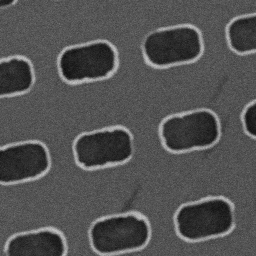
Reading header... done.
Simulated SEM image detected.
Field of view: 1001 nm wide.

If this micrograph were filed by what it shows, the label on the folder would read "holes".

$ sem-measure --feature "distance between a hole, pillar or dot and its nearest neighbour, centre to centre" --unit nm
339